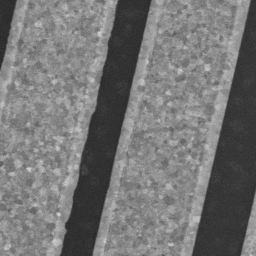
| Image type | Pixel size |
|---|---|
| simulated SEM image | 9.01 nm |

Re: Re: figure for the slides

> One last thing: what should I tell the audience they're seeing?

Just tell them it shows one or a few lines or trenches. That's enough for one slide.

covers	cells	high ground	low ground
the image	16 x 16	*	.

.******...*****.
.******..******.
.*****...******.
.*****...******.
******...*****..
******...*****..
******..******..
*****...******..
*****...*****...
*****...*****...
*****..******...
****...******...
****...*****....
****...*****....
****..******....
***...******....